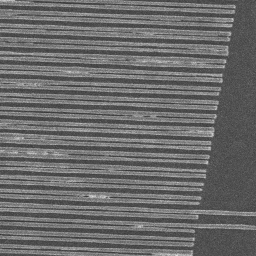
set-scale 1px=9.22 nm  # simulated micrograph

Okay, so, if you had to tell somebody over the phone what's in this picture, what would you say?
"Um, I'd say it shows parallel lines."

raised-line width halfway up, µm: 0.0357